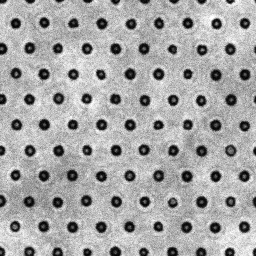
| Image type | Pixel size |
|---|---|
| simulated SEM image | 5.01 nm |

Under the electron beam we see a regular array of ring-shaped grooves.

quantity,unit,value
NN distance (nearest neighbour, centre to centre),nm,142